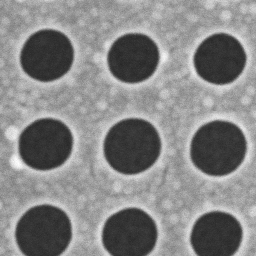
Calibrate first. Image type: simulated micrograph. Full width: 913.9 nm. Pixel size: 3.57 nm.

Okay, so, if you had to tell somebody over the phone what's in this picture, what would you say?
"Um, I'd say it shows holes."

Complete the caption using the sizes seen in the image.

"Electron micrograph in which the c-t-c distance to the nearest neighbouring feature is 308 nm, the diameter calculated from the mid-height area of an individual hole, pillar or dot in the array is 190 nanometres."